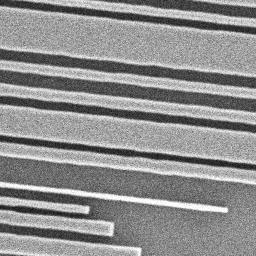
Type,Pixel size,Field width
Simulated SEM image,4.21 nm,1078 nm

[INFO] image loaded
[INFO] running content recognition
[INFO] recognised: groups of lines, slits or small figures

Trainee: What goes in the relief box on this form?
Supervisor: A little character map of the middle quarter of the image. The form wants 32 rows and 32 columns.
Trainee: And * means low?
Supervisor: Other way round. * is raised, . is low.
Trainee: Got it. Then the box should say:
........................********
******..........................
***************.................
..********************..........
............*******************.
....................************
.............................***
******..........................
***************.................
.**********************.........
.........***********************
.................***************
*****....................*******
*************...................
*********************...........
********************************
********************************
********************************
********************************
.*******************************
.........***********************
*................***************
*********.................******
*******************.............
.*****************************..
..........**********************
...................*************
.........................*******
................................
................................
................................
................................